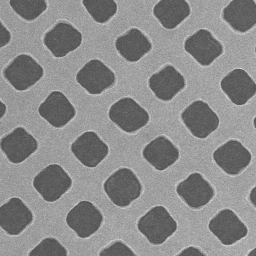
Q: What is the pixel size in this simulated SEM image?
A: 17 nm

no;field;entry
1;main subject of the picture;a regular array of holes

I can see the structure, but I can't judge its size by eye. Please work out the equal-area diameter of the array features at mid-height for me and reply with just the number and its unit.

591 nanometers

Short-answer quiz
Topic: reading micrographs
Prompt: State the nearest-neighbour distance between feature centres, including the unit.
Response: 0.843 microns